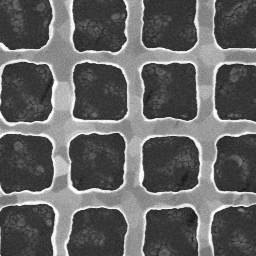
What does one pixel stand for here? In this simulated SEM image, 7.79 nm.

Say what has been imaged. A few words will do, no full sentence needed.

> holes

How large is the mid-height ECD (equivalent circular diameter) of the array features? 481 nm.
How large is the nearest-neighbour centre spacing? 69.9 pixels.